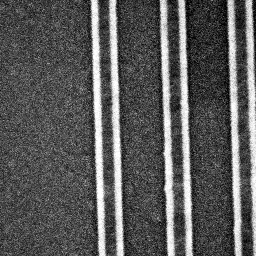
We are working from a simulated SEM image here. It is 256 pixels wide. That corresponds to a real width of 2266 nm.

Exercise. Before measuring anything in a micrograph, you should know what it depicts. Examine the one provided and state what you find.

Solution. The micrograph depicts one or a few lines or trenches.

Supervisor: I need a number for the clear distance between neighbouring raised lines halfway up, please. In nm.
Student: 436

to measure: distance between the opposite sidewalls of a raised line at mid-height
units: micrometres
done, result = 0.168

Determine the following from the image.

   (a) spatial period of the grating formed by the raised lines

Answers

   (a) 606 nanometers